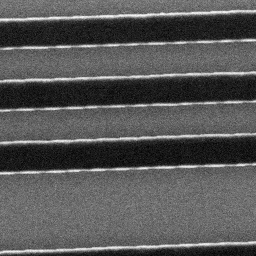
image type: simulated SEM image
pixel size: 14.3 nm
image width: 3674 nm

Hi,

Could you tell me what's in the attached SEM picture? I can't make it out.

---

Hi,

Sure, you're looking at lines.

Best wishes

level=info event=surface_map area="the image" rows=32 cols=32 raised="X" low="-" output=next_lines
--------------------------------
--------------------------XXXXXX
XXXXXXXXXXXXXXXXXXXXXXXXXXXXXXXX
XXXXXXXXXXXXXXXXXXXXXXXXXXXXXXXX
XXXXXXXXXXXXXXXXXXXXXXXXXXXXXXXX
XXXXXXXXXXXXXXXXX---------------
--------------------------------
--------------------------------
--------------------------------
-------------------XXXXXXXXXXXXX
XXXXXXXXXXXXXXXXXXXXXXXXXXXXXXXX
XXXXXXXXXXXXXXXXXXXXXXXXXXXXXXXX
XXXXXXXXXXXXXXXXXXXXXXXXXXXXXXXX
XXXXXXXXXX----------------------
--------------------------------
--------------------------------
--------------------------------
-----------XXXXXXXXXXXXXXXXXXXXX
XXXXXXXXXXXXXXXXXXXXXXXXXXXXXXXX
XXXXXXXXXXXXXXXXXXXXXXXXXXXXXXXX
XXXXXXXXXXXXXXXXXXXXXXXXXXXXXXXX
XXXXX---------------------------
--------------------------------
--------------------------------
--------------------------------
--------------------------------
--------------------------------
--------------------------------
--------------------------------
--------------------------------
--------------------------XXXXXX
-XXXXXXXXXXXXXXXXXXXXXXXXXXXXXXX